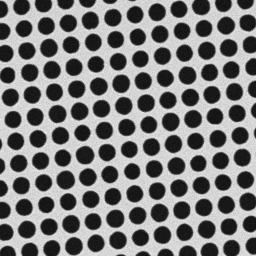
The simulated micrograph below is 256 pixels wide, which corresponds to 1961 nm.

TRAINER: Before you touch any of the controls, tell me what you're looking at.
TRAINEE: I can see a regular array of holes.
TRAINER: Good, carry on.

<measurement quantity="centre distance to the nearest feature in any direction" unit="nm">168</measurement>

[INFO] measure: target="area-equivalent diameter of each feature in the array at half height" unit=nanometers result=136